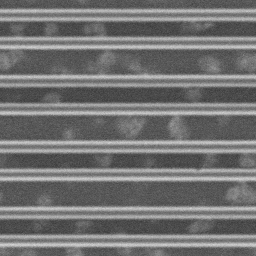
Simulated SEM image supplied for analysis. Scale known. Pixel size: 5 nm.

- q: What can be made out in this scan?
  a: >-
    parallel lines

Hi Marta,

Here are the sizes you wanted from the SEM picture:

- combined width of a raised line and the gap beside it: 161 nm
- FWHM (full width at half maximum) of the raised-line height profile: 47.5 nm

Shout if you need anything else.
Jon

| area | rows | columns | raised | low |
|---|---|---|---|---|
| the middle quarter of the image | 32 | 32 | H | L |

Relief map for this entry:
LLLLLLLLLLLLLLLLLLLLLLLLLLLLLLLL
LLLLLLLLLLLLLLLLLLLLLLLLLLLLLLLL
LLLLLLLLLLLLLLLLLLLLLLLLLLLLLLLL
HHHHHHHHHHHHHHHHHHHHHHHHHHHHHHHH
HHHHHHHHHHHHHHHHHHHHHHHHHHHHHHHH
LLLLLLLLLLLLLLLLLLLLLLLLLLLLLLLL
LLLLLLLLLLLLLLLLLLLLLLLLLLLLLLLL
LLLLLLLLLLLLLLLLLLLLLLLLLLLLLLLL
LLLLLLLLLLLLLLLLLLLLLLLLLLLLLLLL
LLLLLLLLLLLLLLLLLLLLLLLLLLLLLLLL
HHHHHHHHHHHHHHHHHHHHHHHHHHHHHHHH
HHHHHHHHHHHHHHHHHHHHHHHHHHHHHHHH
LLLLLLLLLLLLLLLLLLLLLLLLLLLLLLLL
LLLLLLLLLLLLLLLLLLLLLLLLLLLLLLLL
LLLLLLLLLLLLLLLLLLLLLLLLLLLLLLLL
LLLLLLLLLLLLLLLLLLLLLLLLLLLLLLLL
LLLLLLLLLLLLLLLLLLLLLLLLLLLLLLLL
LLLLLLLLLLLLLLLLLLLLLLLLLLLLLLLL
LLLLLLLLLLLLLLLLLLLLLLLLLLLLLLLL
LLLLLLLLLLLLLLLLLLLLLLLLLLLLLLLL
HHHHHHHHHHHHHHHHHHHHHHHHHHHHHHHH
HHHHHHHHHHHHHHHHHHHHHHHHHHHHHHHH
LLLLLLLLLLLLLLLLLLLLLLLLLLLLLLLL
LLLLLLLLLLLLLLLLLLLLLLLLLLLLLLLL
LLLLLLLLLLLLLLLLLLLLLLLLLLLLLLLL
LLLLLLLLLLLLLLLLLLLLLLLLLLLLLLLL
HHHHHHHHHHHHHHHHHHHHHHHHHHHHHHHH
HHHHHHHHHHHHHHHHHHHHHHHHHHHHHHHH
HHHHHHHHHHHHHHHHHHHHHHHHHHHHHHHH
LLLLLLLLLLLLLLLLLLLLLLLLLLLLLLLL
LLLLLLLLLLLLLLLLLLLLLLLLLLLLLLLL
LLLLLLLLLLLLLLLLLLLLLLLLLLLLLLLL